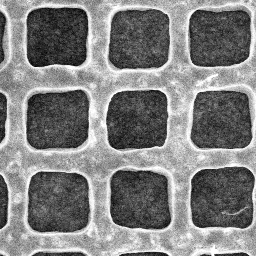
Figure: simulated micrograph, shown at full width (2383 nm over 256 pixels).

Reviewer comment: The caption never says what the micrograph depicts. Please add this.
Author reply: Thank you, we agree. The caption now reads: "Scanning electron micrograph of a regular array of holes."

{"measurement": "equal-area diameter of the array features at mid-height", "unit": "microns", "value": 0.618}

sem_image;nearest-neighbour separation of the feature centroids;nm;742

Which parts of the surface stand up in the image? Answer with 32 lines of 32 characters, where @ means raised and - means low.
@@@@@@@@@@@@@@@@@@@@@@@@@@@@@@@@
@@@@-------@@@@-----@@@@-------@
-@@--------@@@-------@@@-------@
-@@--------@@@-------@@@-------@
-@@--------@@@-------@@--------@
-@@--------@@@-------@@--------@
-@@--------@@--------@@@-------@
-@@@-------@@--------@@@-------@
@@@@@@@@@@@@@@------@@@@@@@@@@@@
@@@@@@@@@@@@@@@@@@@@@@@@@@@@@@@@
@@@@@@@@@@@@@@@@@@@@@@@@@@@@@@@@
@@@@-------@@@@-----@@@@@------@
-@@--------@@@-------@@@--------
-@@--------@@--------@@@--------
-@@--------@@--------@@@--------
-@@--------@@--------@@@--------
-@@--------@@--------@@@--------
@@@--------@@--------@@@-------@
@@@@------@@@@-----@@@@@@-----@@
@@@@@@@@@@@@@@@@@@@@@@@@@@@@@@@@
@@@@@@@@@@@@@@@@@@@@@@@@@@@@@@@@
@@@@@---@@@@@@------@@@@@------@
-@@@-------@@@-------@@@--------
-@@@-------@@@-------@@@--------
-@@--------@@@-------@@@--------
-@@--------@@@-------@@@--------
-@@--------@@@--------@@--------
-@@@-------@@@--------@@--------
@@@@-------@@@@@-@---@@@@-@@@@-@
@@@@@@@@@@@@@@@@@@@@@@@@@@@@@@@@
@@@@@@@@@@@@@@@@@@@@@@@@@@@@@@@@
@@@@@-@@@@@@@@@@@@--@@@@@@@@@@@@